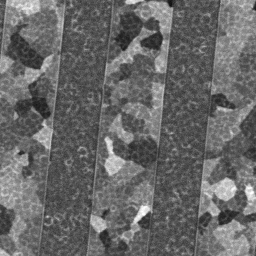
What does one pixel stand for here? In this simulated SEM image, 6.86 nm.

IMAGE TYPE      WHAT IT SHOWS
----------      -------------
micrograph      one or a few lines or trenches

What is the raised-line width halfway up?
0.408 um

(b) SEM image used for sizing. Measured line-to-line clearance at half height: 0.324 µm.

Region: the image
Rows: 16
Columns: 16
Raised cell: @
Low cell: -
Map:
@@@@---@@@@---@@
@@@@---@@@@---@@
@@@@---@@@@---@@
@@@@---@@@---@@@
@@@@---@@@---@@@
@@@@--@@@@---@@@
@@@---@@@@---@@@
@@@---@@@@---@@@
@@@---@@@@---@@@
@@@---@@@@---@@@
@@@---@@@@---@@@
@@@---@@@@---@@@
@@@---@@@@---@@@
@@@---@@@---@@@@
@@@---@@@---@@@@
@@---@@@@---@@@@